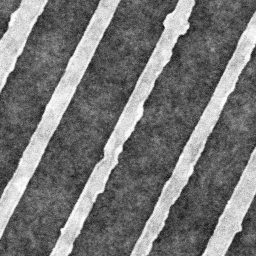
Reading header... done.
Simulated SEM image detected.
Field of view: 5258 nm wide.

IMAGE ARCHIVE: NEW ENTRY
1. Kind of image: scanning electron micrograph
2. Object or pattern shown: one or a few lines or trenches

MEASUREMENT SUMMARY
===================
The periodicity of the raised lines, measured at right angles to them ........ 1430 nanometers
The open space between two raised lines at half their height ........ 1120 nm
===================